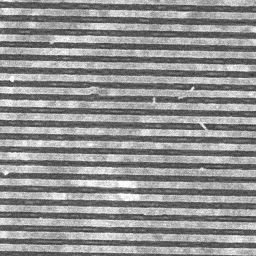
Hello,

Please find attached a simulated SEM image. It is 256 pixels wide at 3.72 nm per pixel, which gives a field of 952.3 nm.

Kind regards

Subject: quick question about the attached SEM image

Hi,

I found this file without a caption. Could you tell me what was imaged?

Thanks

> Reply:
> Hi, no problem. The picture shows parallel lines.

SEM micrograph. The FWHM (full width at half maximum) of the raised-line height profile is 23.3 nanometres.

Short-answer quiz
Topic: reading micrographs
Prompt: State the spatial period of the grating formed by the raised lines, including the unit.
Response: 48.8 nm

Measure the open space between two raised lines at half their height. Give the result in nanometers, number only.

26.1